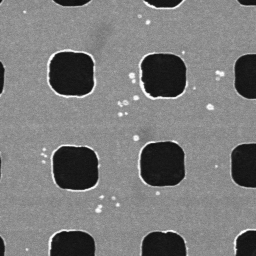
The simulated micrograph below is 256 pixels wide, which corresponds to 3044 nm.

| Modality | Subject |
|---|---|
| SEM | holes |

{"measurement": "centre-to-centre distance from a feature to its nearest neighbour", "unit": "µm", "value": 1.05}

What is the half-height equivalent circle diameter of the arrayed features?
564 nm